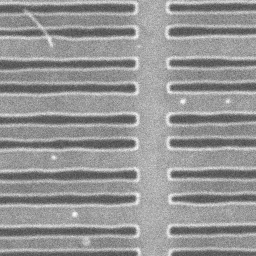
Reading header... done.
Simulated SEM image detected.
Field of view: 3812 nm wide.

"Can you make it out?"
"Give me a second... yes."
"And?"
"groups of lines, slits or small figures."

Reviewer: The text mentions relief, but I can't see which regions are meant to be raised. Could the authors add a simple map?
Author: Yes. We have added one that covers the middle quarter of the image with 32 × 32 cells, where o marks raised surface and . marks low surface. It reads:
oooooooooooooooooo........oooooo
................................
................................
................................
................................
oooooooooooooooooo........oooooo
oooooooooooooooooo........oooooo
...............ooo..............
................................
................................
................................
................................
.............ooooo..........oooo
ooooooooooooooooooo.......oooooo
ooooooooooooooooooo.......oooooo
................................
................................
................................
...........oooooo.........oooooo
oooooooooooooooooo........oooooo
oooooooooooooooooo........oooooo
......oooooo....................
................................
................................
................................
................................
.oooooo.......oooo.........ooooo
ooooooooooooooooooo.......oooooo
ooooooooooooooooooo.......oooooo
................................
................................
................................